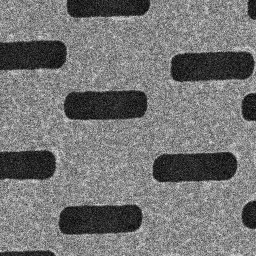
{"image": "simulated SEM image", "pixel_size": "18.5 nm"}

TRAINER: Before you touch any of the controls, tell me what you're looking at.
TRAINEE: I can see holes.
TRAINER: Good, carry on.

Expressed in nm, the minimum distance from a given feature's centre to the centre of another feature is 1950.